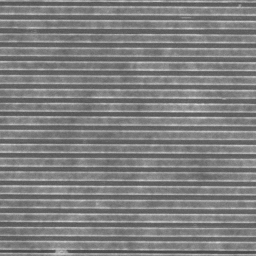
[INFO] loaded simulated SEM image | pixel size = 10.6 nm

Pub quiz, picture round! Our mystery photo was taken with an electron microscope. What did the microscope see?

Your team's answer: parallel lines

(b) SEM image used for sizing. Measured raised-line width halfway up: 0.0914 um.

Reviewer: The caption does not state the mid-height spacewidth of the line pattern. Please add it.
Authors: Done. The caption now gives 51.7 nanometers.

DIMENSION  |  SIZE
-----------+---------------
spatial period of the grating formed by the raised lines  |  0.146 micrometres